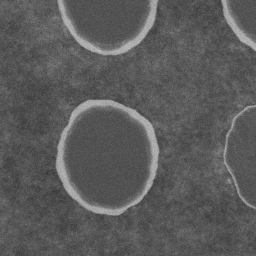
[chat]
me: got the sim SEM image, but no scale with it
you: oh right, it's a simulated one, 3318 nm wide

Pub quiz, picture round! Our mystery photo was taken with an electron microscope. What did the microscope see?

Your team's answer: raised bodies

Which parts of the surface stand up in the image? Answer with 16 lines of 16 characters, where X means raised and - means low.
----XXXXXX----XX
----XXXXX-----XX
-----XXXX------X
----------------
----------------
----------------
-----XX---------
----XXXXX-------
----XXXXXX------
----XXXXXX------
----XXXXXX------
----XXXXX-------
-----XXXX-------
----------------
----------------
----------------